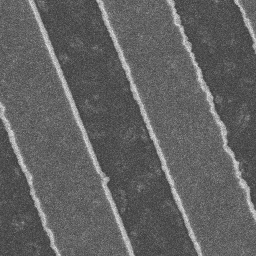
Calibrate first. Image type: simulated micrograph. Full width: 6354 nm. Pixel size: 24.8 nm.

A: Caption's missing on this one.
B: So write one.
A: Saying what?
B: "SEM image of one or a few lines or trenches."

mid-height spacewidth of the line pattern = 1.56 µm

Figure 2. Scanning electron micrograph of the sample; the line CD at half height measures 1690 nanometres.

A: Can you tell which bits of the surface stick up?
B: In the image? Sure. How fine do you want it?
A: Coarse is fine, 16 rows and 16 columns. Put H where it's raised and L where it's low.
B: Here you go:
HHLLLLHHHHHLLLLH
HHHLLLLHHHHLLLLL
HHHLLLLHHHHHLLLL
HHHLLLLLHHHHLLLL
HHHHLLLLHHHHLLLL
HHHHLLLLHHHHHLLL
HHHHHLLLLHHHHLLL
HHHHHLLLLHHHHHLL
LHHHHLLLLLHHHHLL
LHHHHHLLLLHHHHLL
LHHHHHLLLLHHHHHL
LLHHHHHLLLLHHHHL
LLHHHHHLLLLHHHHH
LLLHHHHLLLLLHHHH
LLLHHHHHLLLLHHHH
LLLHHHHHLLLLHHHH